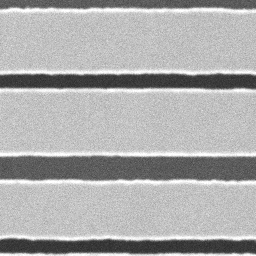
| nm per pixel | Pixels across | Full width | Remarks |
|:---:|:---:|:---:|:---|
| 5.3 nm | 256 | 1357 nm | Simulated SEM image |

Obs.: lines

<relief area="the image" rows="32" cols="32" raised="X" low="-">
--------------------------------
XXXXXXXXXXXXXXXXXXXXXXXXXXXXXXXX
XXXXXXXXXXXXXXXXXXXXXXXXXXXXXXXX
XXXXXXXXXXXXXXXXXXXXXXXXXXXXXXXX
XXXXXXXXXXXXXXXXXXXXXXXXXXXXXXXX
XXXXXXXXXXXXXXXXXXXXXXXXXXXXXXXX
XXXXXXXXXXXXXXXXXXXXXXXXXXXXXXXX
XXXXXXXXXXXXXXXXXXXXXXXXXXXXXXXX
XXXXXXXXXXXXXXXXXXXXXXXXXXXXXXXX
--------------------------------
--------------------------------
XXXXXXXXXXXXXXXXXXXXXXXXXXXXXXXX
XXXXXXXXXXXXXXXXXXXXXXXXXXXXXXXX
XXXXXXXXXXXXXXXXXXXXXXXXXXXXXXXX
XXXXXXXXXXXXXXXXXXXXXXXXXXXXXXXX
XXXXXXXXXXXXXXXXXXXXXXXXXXXXXXXX
XXXXXXXXXXXXXXXXXXXXXXXXXXXXXXXX
XXXXXXXXXXXXXXXXXXXXXXXXXXXXXXXX
XXXXXXXXXXXXXXXXXXXXXXXXXXXXXXXX
--------------------------------
--------------------------------
--------------------------------
--------------------------------
XXXXXXXXXXXXXXXXXXXXXXXXXXXXXXXX
XXXXXXXXXXXXXXXXXXXXXXXXXXXXXXXX
XXXXXXXXXXXXXXXXXXXXXXXXXXXXXXXX
XXXXXXXXXXXXXXXXXXXXXXXXXXXXXXXX
XXXXXXXXXXXXXXXXXXXXXXXXXXXXXXXX
XXXXXXXXXXXXXXXXXXXXXXXXXXXXXXXX
XXXXXXXXXXXXXXXXXXXXXXXXXXXXXXXX
--------------------------------
--------------------------------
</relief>